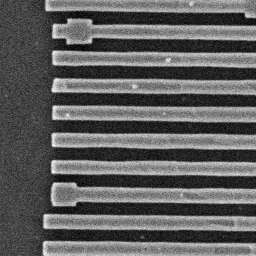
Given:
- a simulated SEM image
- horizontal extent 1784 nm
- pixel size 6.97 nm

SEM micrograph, wiring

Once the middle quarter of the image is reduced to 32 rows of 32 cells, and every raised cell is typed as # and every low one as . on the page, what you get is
................................
................................
................................
................................
################################
################################
################################
................................
................................
................................
................................
################################
################################
################################
................................
................................
................................
######..........................
################################
################################
################################
................................
................................
................................
###########....#############....
################################
################################
...................#############
................................
................................
###.............................
################################